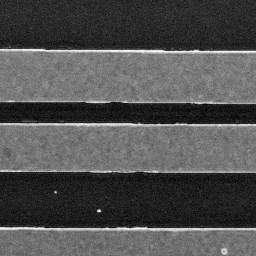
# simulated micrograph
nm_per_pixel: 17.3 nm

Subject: lines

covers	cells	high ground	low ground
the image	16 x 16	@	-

----------------
----------------
----------------
@@@@@@@@@@@@@@@@
@@@@@@@@@@@@@@@@
@@@@@@@@@@@@@@@@
----------------
----------------
@@@@@@@@@@@@@@@@
@@@@@@@@@@@@@@@@
@@@@@@@@@@@@@@@@
----------------
----------------
----------------
@@@@@@@@@@@@@@@@
@@@@@@@@@@@@@@@@